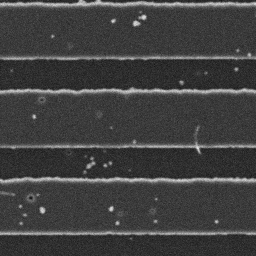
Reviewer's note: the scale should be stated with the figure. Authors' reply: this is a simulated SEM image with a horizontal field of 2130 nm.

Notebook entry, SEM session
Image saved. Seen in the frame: lines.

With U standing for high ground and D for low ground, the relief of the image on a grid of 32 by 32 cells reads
UUUUUUUUDUUUUUUUUUUUUUUDUUUUUUUU
UUUUUUUUUUUUUUUUUUUUUUUUUUUUUUUU
UUUUUUUUUUUUUUUUUUUUUUUUUUUUUUUU
UUUUUUUUUUUUUUUUUUUUUUUUUUUUUUUU
UUUUUUUUUUUUUUUUUUUUUUUUUUUUUUUU
UUUUUUUUUUUUUUUUUUUUUUUUUUUUUUUU
UUUUUUUUUUUUUUUUUUUUUUUUUUUUUUUU
DDDDDDDDDDDDDDDDDDDDDDDDDDDDDDDD
DDDDDDDDDDDDDDDDDDDDDDDDDDDDDDDD
DDDDDDDDDDDDDDDDDDDDDDDDDDDDDDDD
DDDDDDDDDDDDDDDDDDDDDDDDDDDDDDDD
UUUUUUUUUUUUUUUUUUUUUUUUUUUUUUUU
UUUUUUUUUUUUUUUUUUUUUUUUUUUUUUUU
UUUUUUUUUUUUUUUUUUUUUUUUUUUUUUUU
UUUUUUUUUUUUUUUUUUUUUUUUUUUUUUUU
UUUUUUUUUUUUUUUUUUUUUUUUUUUUUUUU
UUUUUUUUUUUUUUUUUUUUUUUUUUUUUUUU
UUUUUUUUUUUUUUUUUUUUUUUUUUUUUUUU
DUDDDDDDDDDDDDDDDDDDDDDDUDDDDDDD
DDDDDDDDDDDDDDDDDDDDDDDDDDDDDDDD
DDDDDDDDDDDDDDDDDDDDDDDDDDDDDDDD
DDDDDDDDDDDDDDDDDDDDDDDDDDDDDDDD
DUUUUUUUUUUUUUUUUUUUUUDUUUUUUUUU
UUUUUUUUUUUUUUUUUUUUUUUUUUUUUUUU
UUUUUUUUUUUUUUUUUUUUUUUUUUUUUUUU
UUUUUUUUUUUUUUUUUUUUUUUUUUUUUUUU
UUUUUUUUUUUUUUUUUUUUUUUUUUUUUUUU
UUUUUUUUUUUUUUUUUUUUUUUUUUUUUUUU
UUUUUUUUUUUUUUUUUUUUUUUUUUUUUUUU
DDDDDDDDDDDDDDDDDDDDDDDDDDDDDDDD
DDDDDDDDDDDDDDDDDDDDDDDDDDDDDDDD
DDDDDDDDDDDDDDDDDDDDDDDDDDDDDDDD